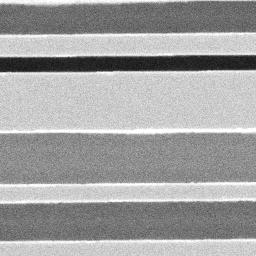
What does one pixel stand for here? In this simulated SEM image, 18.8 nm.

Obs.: lines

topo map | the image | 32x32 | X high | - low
--------------------------------
--------------------------------
--------------------------------
--------------------------------
-----XXXXXXXXXXXXXXXXXXXXXXXXXXX
XXXXXXXXXXXXXXXXXXXXXXXXXXXXXXXX
XXXXXXXXXXXXXXXXXXXXXXXXXXXXXXXX
--------------------------------
--------------------------------
XXXXXXXXXXXXXXXXXXXXXXXXXXXXXXXX
XXXXXXXXXXXXXXXXXXXXXXXXXXXXXXXX
XXXXXXXXXXXXXXXXXXXXXXXXXXXXXXXX
XXXXXXXXXXXXXXXXXXXXXXXXXXXXXXXX
XXXXXXXXXXXXXXXXXXXXXXXXXXXXXXXX
XXXXXXXXXXXXXXXXXXXXXXXXXXXXXXXX
XXXXXXXXXXXXXXXXXXXXXXXXXXXXXXXX
--------------------------------
--------------------------------
--------------------------------
--------------------------------
--------------------------------
--------------------------------
--------------------------------
XXXXXXXXXXXXXXXXXXXXXXXXXXXXXXXX
XXXXXXXXXXXXXXXXXXXXXXXXXXXXXXXX
--------------------------------
--------------------------------
--------------------------------
--------------------------------
--------------------------------
XXXXXXXXXXXXXXXXXXXXXXXXXXXXXXXX
XXXXXXXXXXXXXXXXXXXXXXXXXXXXXXXX